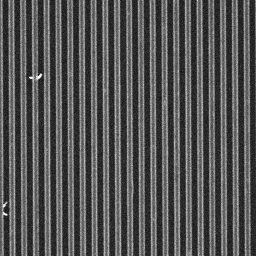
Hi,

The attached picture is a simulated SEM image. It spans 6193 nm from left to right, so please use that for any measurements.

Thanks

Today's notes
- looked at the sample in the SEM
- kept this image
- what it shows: parallel lines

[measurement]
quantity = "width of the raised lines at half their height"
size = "124 nanometres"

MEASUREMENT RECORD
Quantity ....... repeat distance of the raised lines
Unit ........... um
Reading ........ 0.284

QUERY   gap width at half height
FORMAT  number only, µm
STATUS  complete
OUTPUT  0.166